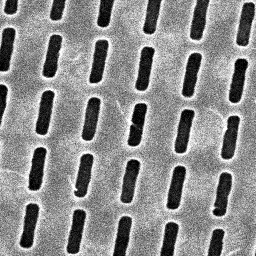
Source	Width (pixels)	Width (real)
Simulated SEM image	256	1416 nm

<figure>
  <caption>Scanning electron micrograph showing a regular array of holes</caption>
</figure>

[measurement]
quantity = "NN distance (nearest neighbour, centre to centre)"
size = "259 nm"